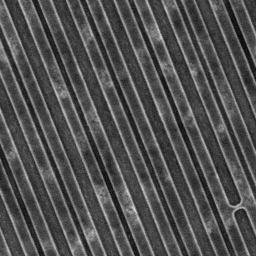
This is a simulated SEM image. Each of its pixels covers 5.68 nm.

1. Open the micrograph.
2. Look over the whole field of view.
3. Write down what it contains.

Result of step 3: parallel lines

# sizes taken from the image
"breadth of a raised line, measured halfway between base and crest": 73.1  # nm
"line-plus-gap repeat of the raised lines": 125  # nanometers